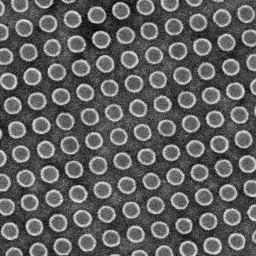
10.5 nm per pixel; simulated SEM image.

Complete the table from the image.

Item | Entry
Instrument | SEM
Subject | a regular array of raised bodies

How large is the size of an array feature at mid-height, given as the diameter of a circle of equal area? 172 nanometers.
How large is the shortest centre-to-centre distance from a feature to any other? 24.4 pixels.